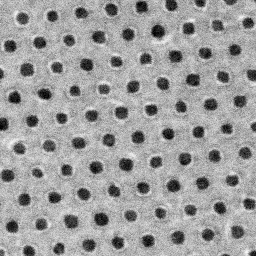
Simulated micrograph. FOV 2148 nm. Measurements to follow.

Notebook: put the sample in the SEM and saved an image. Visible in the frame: a regular array of raised bodies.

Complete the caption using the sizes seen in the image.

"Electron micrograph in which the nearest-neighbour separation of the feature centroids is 246 nm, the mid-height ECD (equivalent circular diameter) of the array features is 0.133 micrometres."